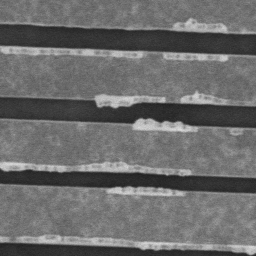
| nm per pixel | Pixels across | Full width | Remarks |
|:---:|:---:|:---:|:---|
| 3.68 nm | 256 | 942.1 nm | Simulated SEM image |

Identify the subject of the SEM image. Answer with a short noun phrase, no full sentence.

one or a few lines or trenches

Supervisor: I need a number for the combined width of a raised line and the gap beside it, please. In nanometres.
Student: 260